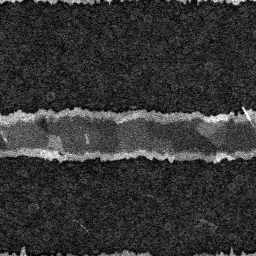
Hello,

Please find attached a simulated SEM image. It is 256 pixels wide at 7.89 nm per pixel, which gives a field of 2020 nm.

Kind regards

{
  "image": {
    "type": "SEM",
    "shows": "one or a few lines or trenches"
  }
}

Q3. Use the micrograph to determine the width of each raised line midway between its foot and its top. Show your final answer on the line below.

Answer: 320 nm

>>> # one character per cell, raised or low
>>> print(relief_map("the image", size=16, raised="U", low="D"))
DDDDDDDDDDDDDDDD
DDDDDDDDDDDDDDDD
DDDDDDDDDDDDDDDD
DDDDDDDDDDDDDDDD
DDDDDDDDDDDDDDDD
DDDDDDDDDDDDDDDD
DDDDDDDDDDDDDDDD
UUUUUUUUUUUUUUUU
UUUUUUUUUUUUUUUU
UUUUUUUUUUUUUUUU
DDDDDDDDDDDDDDDD
DDDDDDDDDDDDDDDD
DDDDDDDDDDDDDDDD
DDDDDDDDDDDDDDDD
DDDDDDDDDDDDDDDD
DDDDDDDDDDDDDDDD